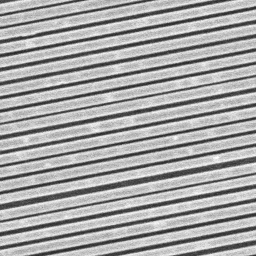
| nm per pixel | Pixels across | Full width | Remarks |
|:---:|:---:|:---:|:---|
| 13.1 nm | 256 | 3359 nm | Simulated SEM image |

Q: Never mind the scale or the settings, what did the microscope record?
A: parallel lines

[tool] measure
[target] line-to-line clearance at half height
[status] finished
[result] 51.6 nanometres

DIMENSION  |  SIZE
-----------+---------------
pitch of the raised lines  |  178 nanometers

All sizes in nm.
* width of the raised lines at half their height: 126